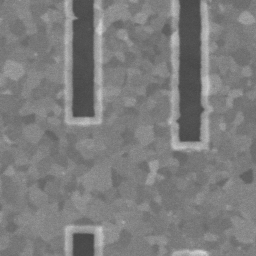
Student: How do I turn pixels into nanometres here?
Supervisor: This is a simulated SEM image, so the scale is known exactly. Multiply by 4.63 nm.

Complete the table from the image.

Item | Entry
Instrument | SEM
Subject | one or a few lines or trenches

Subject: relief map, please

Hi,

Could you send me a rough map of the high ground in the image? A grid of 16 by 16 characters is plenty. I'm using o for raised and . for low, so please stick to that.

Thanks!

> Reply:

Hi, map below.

oooo..ooooo..ooo
oooo..ooooo..ooo
oooo..ooooo..ooo
oooo..ooooo..ooo
oooo..ooooo..ooo
oooo..ooooo..ooo
oooo..ooooo..ooo
ooooo.ooooo..ooo
ooooooooooo..ooo
oooooooooooooooo
oooooooooooooooo
oooooooooooooooo
oooooooooooooooo
oooooooooooooooo
oooo..oooooooooo
oooo..oooooooooo